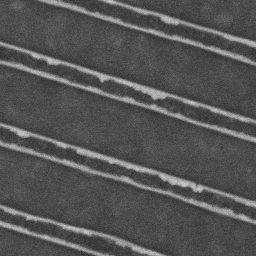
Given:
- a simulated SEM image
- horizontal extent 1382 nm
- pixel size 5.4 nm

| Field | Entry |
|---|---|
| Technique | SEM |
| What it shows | one or a few lines or trenches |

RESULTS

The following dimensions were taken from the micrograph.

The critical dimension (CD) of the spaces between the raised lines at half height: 0.319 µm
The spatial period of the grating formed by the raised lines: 413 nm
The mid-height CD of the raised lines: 98.7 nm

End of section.